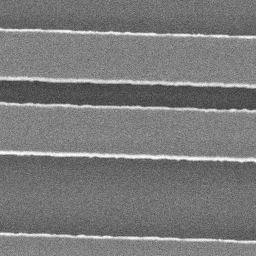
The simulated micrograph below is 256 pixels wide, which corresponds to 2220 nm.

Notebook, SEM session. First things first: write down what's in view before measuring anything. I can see lines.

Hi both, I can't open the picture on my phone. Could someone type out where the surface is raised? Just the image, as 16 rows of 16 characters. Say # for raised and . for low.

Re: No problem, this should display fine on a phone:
................
................
################
################
################
................
##..............
################
################
################
................
................
................
................
................
################